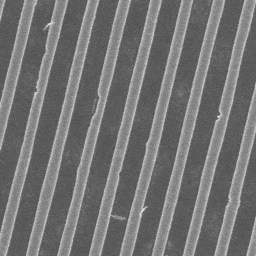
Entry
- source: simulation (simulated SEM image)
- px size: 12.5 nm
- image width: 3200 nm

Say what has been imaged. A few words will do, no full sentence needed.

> parallel lines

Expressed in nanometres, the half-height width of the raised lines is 143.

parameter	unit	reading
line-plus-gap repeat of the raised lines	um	0.382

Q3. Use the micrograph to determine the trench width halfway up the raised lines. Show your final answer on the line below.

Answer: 246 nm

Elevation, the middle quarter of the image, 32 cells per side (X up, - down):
--XXX-----XXX-----XXX-----XX----
--XXX-----XXX----XXX-----XXX----
--XX-----XXX-----XXX-----XXX----
-XXX-----XXX-----XXX-----XX-----
-XXX-----XXX-----XX------XX-----
-XXX-----XX-----XXX-----XXX-----
-XX-----XXX-----XXX-----XXX-----
XXX------XX-----XXX-----XXX-XX--
XXX------XX-----XXX-----XX-----X
XXX------X------XX-----XXX-----X
XX------XX-----XXX-----XXX-----X
XX------XX-----XXX-----XXX-----X
XX------XX-----XXX-----XXX----XX
XX-----XX------XX-----XXX-----XX
X------XX-----XXX-----XXX-----XX
X-----XXX-----XXX-----XXX-----XX
X-----XXX-----XXX-----XXX----XXX
X-----XXX-----XX------XX-----XXX
------XX-----XXX-----XXX-----XXX
-----XXX-----XXX-----XXX-----XXX
-----XXX-----XXX-----XXX-----XX-
-----XXX-----XX------XX-----XXX-
-----XX-----XXX-----XXX-----XXX-
----XXX-----XXX-----XXX-----XXX-
----XXX-----XXX-----XXX-----XX--
----XXX-----XX------XX------XX--
---XXX-----XXX-----XXX-----XXX--
---XXX-----XXX-----XXX-----XXX--
---XXX-----XXX-----XXX-----XX---
---XXX-----XX------XX-----XXX---
---XX------XX-----XXX-----XXX---
--XXX-----XXX-----XXX-----XXX---